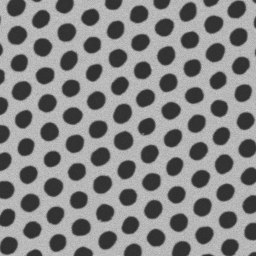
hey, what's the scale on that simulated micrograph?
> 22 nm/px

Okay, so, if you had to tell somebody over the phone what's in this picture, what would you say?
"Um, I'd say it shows a regular array of holes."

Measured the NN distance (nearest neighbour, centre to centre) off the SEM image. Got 27.6 pixels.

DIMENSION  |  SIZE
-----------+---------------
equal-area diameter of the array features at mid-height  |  394 nm